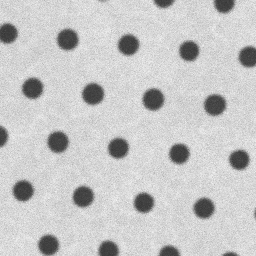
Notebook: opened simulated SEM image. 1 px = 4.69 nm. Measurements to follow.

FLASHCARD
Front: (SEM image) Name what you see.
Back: a regular array of holes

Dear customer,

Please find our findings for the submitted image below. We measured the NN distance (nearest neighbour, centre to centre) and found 281 nanometers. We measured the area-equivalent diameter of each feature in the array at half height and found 98.5 nm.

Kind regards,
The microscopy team